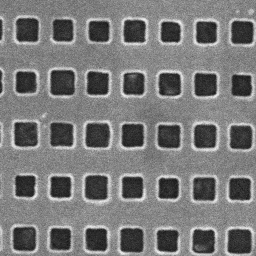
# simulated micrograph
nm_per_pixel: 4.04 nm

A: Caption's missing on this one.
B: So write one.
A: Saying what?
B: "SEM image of a regular array of holes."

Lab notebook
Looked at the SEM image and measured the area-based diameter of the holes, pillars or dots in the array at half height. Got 24.8 px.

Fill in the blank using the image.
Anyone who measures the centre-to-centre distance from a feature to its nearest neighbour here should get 0.144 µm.